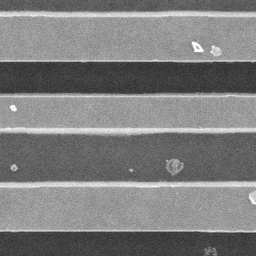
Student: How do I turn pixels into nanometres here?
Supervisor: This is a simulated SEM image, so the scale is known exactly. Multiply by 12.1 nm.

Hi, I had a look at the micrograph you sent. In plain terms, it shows lines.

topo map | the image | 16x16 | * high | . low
................
****************
****************
****************
................
................
****************
****************
................
................
................
................
****************
****************
................
................